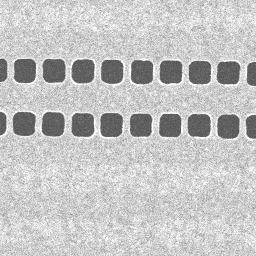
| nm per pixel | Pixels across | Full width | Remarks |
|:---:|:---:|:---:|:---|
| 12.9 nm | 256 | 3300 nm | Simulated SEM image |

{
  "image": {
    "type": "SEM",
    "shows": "a regular array of holes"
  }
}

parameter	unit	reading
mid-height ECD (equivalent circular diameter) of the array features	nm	327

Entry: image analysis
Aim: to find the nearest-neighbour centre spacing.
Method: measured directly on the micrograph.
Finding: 370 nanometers